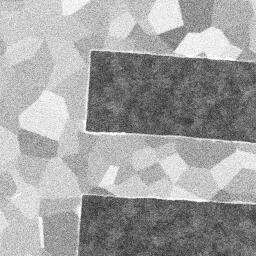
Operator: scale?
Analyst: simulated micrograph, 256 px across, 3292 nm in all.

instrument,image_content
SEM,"one or a few lines or trenches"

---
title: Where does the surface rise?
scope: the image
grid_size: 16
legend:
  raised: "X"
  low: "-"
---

XXXXXXXXXXXXXXXX
XXXXXXXXXXXXXXXX
XXXXXXXXXXXXXXXX
XXXXXX-----XXXXX
XXXXXX----------
XXXXX-----------
XXXXX-----------
XXXXX-----------
XXXXXXXXXX------
XXXXXXXXXXXXXXXX
XXXXXXXXXXXXXXXX
XXXXXXXXXXXXXXXX
XXXXX-------XXXX
XXXXX-----------
XXXXX-----------
XXXXX-----------